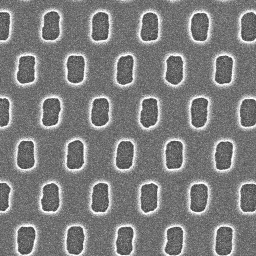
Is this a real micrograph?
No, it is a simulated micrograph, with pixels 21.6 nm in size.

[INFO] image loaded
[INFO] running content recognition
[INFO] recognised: a regular array of holes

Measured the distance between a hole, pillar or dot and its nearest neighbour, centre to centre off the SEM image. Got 1060 nm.